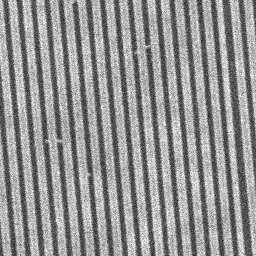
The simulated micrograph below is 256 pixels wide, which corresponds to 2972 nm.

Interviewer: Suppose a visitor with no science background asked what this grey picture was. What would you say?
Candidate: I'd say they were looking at parallel lines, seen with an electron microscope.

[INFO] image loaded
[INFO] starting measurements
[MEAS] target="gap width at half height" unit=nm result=67.9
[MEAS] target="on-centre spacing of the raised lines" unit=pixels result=13.8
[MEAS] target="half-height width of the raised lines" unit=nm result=89.6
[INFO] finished